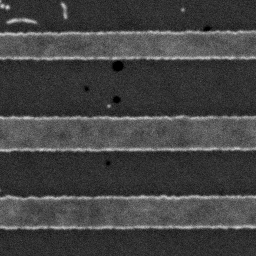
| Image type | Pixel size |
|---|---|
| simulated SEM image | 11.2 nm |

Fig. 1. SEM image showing lines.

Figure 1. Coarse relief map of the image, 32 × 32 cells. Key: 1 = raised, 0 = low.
00000000000000000000000000000000
00000000000000000000000000000000
00000000000000000000000000000000
00000000000000000000000000000000
11111111111111111111111111111111
11111111111111111111111111111111
11111111111111111111111111111111
00000000000000000000000000000000
00000000000000000000000000000000
00000000000000000000000000000000
00000000000000000000000000000000
00000000000000000000000000000000
00000000000000000000000000000000
00000000000000000000000000000000
00000000000000000000000000000000
11111111111111111111111111111111
11111111111111111111111111111111
11111111111111111111111111111111
11111111111111111111111111111111
00000000000000000000000000000000
00000000000000000000000000000000
00000000000000000000000000000000
00000000000000000000000000000000
00000000000000000000000000000000
00000000000000000000000000000000
11111111111111111111111111111111
11111111111111111111111111111111
11111111111111111111111111111111
11111001100010110000000000000000
00000000000000000000000000000000
00000000000000000000000000000000
00000000000000000000000000000000